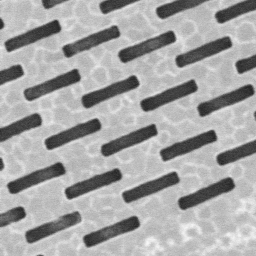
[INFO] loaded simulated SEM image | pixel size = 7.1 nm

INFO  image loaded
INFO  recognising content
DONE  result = a regular array of holes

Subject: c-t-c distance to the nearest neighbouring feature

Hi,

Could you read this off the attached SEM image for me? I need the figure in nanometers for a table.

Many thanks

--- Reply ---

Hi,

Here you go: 373